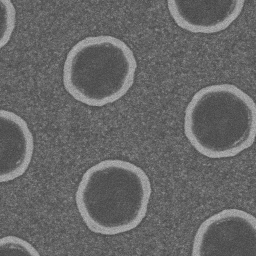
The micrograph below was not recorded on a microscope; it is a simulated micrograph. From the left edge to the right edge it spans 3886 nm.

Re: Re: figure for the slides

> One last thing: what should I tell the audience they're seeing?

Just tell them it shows raised bodies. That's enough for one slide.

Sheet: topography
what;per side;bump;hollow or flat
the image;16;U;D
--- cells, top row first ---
UDDDDDDDDDDUUUUD
UDDDDDDDDDDDUUDD
DDDDDDUDDDDDDDDD
DDDDUUUUDDDDDDDD
DDDDUUUUDDDDDDDD
DDDDUUUUDDDDDDDD
DDDDDDDDDDDDUUUU
UDDDDDDDDDDDUUUU
UUDDDDDDDDDDUUUU
UUDDDDDDDDDDDUUD
UDDDDDUUDDDDDDDD
DDDDDUUUUDDDDDDD
DDDDDUUUUDDDDDDD
DDDDDUUUUDDDDDUD
DDDDDDDDDDDDDUUU
UUDDDDDDDDDDUUUU